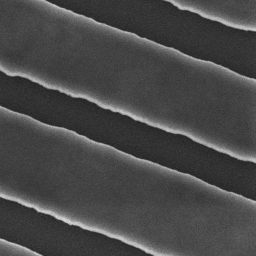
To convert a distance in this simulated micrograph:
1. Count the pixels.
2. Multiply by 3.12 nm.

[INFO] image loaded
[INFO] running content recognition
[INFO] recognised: lines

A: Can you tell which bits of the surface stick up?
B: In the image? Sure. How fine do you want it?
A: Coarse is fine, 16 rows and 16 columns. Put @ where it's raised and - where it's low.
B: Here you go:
@@@@-------@@@@@
@@@@@@--------@@
@@@@@@@@@-------
@@@@@@@@@@@@----
@@@@@@@@@@@@@@@-
---@@@@@@@@@@@@@
------@@@@@@@@@@
@@-------@@@@@@@
@@@@@-------@@@@
@@@@@@@@------@@
@@@@@@@@@@------
@@@@@@@@@@@@@---
-@@@@@@@@@@@@@@@
---@@@@@@@@@@@@@
------@@@@@@@@@@
@@-------@@@@@@@